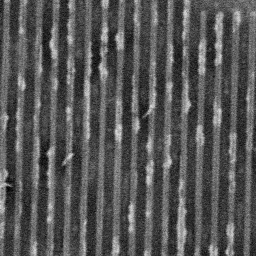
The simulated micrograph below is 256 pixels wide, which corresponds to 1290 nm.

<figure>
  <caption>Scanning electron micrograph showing parallel lines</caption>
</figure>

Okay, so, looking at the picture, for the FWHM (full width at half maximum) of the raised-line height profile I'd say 24.6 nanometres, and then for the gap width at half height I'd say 58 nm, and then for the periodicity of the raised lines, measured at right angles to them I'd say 16.4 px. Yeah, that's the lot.